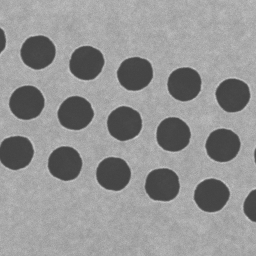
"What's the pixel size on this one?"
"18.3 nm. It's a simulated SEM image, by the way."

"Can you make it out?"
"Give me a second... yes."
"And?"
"a regular array of holes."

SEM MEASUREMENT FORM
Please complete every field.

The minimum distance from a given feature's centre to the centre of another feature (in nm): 914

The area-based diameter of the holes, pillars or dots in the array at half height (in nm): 639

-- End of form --